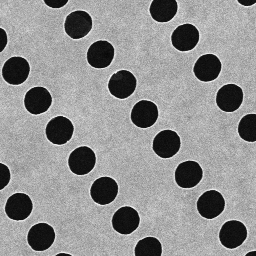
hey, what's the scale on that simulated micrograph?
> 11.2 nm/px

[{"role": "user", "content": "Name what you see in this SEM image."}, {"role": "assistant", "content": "a regular array of holes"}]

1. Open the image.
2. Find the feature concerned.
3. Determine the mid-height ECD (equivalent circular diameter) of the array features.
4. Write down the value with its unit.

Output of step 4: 0.314 um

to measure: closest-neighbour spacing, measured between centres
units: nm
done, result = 415